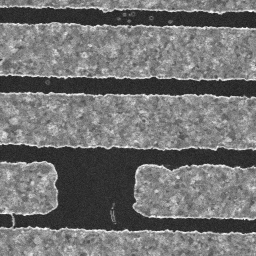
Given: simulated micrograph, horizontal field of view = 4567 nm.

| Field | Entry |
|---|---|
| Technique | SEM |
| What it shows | one or a few lines or trenches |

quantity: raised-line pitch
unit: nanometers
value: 1240